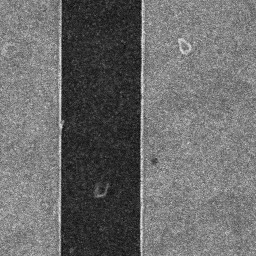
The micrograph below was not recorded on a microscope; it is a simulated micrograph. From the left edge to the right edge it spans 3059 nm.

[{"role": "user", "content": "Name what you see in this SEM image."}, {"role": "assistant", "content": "one or a few lines or trenches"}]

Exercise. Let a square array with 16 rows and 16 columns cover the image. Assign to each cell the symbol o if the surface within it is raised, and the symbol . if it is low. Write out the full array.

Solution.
oooo.....ooooooo
oooo.....ooooooo
oooo.....ooooooo
oooo.....ooooooo
oooo.....ooooooo
oooo.....ooooooo
oooo.....ooooooo
oooo.....ooooooo
oooo.....ooooooo
oooo.....ooooooo
oooo.....ooooooo
oooo.....ooooooo
oooo.....ooooooo
oooo.....ooooooo
oooo.....ooooooo
oooo.....ooooooo